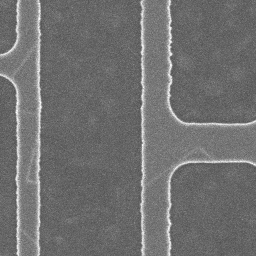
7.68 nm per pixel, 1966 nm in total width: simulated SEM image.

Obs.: one or a few lines or trenches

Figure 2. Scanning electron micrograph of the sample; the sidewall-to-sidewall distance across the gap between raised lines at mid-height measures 0.785 um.